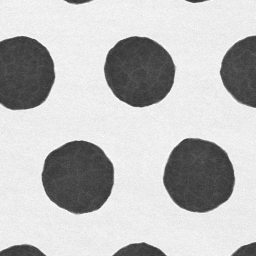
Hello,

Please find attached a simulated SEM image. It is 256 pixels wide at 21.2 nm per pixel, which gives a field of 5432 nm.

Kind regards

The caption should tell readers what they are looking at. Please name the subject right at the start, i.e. holes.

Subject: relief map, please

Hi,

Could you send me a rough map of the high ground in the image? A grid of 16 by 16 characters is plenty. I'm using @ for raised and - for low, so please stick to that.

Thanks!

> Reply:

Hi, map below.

@@@@@@@@@@@@@@@@
@@@@@@@@@@@@@@@@
--@@@@@@--@@@@@-
---@@@@----@@@--
---@@@@----@@@--
---@@@@----@@@--
---@@@@@--@@@@@-
@@@@@@@@@@@@@@@@
@@@@@@@@@@@@@@@@
@@@---@@@@@---@@
@@@----@@@-----@
@@@----@@@-----@
@@@----@@@@---@@
@@@@@@@@@@@@@@@@
@@@@@@@@@@@@@@@@
--@@@@@@--@@@@@-